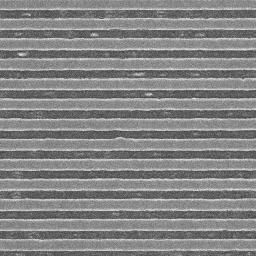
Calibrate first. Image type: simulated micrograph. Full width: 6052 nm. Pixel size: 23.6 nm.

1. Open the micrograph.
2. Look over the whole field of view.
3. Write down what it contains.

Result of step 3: parallel lines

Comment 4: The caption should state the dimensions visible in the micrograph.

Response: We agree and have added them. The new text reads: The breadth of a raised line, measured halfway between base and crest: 260 nanometres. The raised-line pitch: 20.1 pixels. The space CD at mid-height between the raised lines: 213 nanometres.